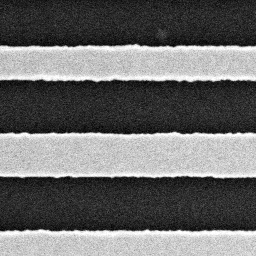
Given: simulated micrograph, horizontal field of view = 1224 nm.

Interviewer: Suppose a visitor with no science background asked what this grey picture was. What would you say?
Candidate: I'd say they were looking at lines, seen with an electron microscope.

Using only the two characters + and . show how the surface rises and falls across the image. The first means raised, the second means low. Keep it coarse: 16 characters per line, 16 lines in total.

................
................
................
++++++++++++++++
++++++++++++++++
................
................
................
++++++++++++++++
++++++++++++++++
++++++++++++++++
................
................
................
++++++++++++++++
++++++++++++++++